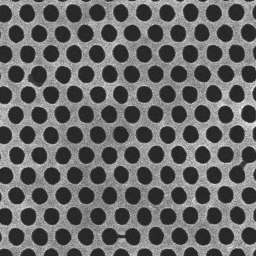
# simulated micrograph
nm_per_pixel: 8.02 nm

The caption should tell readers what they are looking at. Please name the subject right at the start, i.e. a regular array of holes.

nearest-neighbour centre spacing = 183 nm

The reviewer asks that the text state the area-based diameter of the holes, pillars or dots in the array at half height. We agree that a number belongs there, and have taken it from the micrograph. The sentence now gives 134 nm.